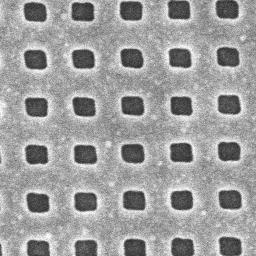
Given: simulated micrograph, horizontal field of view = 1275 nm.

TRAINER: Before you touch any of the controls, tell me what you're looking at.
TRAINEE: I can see a regular array of holes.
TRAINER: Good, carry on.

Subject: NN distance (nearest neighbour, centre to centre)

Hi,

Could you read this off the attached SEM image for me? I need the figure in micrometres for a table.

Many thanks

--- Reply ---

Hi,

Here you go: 0.235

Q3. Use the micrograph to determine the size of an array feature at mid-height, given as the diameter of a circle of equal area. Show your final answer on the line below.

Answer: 23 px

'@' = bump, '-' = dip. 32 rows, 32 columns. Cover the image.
@@@--@@@@--@@@@---@@@---@@@---@@
@@@---@@@---@@@---@@@---@@@---@@
@@@---@@@---@@@@-@@@@@@@@@@@@@@@
@@@@@@@@@@@@@@@@@@@@@@@@@@@@@@@@
@@@@@@@@@@@@@@@@@@@@@@@@@@@@@@@@
@@@@@@@@@@@@@@@@@@@@@@@@@@@@@@@@
@@@--@@@@---@@@---@@@---@@@---@@
@@@---@@@---@@@---@@@---@@@---@@
@@@---@@@@--@@@@@@@@@@@@@@@@@@@@
@@@@@@@@@@@@@@@@@@@@@@@@@@@@@@@@
@@@@@@@@@@@@@@@@@@@@@@@@@@@@@@@@
@@@@@@@@@@@@@@@@@@@@@@@@@@@@@@@@
@@@---@@@---@@@---@@@---@@@---@@
@@@---@@@---@@@---@@@---@@@---@@
@@@@--@@@@--@@@@@@@@@@@@@@@@@@@@
@@@@@@@@@@@@@@@@@@@@@@@@@@@@@@@@
@@@@@@@@@@@@@@@@@@@@@@@@@@@@@@@@
@@@@@@@@@@@@@@@@@@@@@@@@@@@@@@@@
@@@---@@@---@@@---@@@---@@@---@@
@@@---@@@---@@@---@@@---@@@---@@
@@@@-@@@@@--@@@@@@@@@@@@@@@@@@@@
@@@@@@@@@@@@@@@@@@@@@@@@@@@@@@@@
@@@@@@@@@@@@@@@@@@@@@@@@@@@@@@@@
@@@@@@@@@@@@@@@@@@@@@@@@@@@@@@@@
@@@---@@@---@@@---@@@---@@@---@@
@@@---@@@---@@@---@@@---@@@---@@
@@@@--@@@@@@@@@@@@@@@@@@@@@@@@@@
@@@@@@@@@@@@@@@@@@@@@@@@@@@@@@@@
@@@@@@@@@@@@@@@@@@@@@@@@@@@@@@@@
@@@@@@@@@@@@@@@@@@@@@@@@@@@@@@@@
@@@---@@@---@@@---@@@---@@@---@@
@@@---@@@---@@@---@@@---@@@---@@